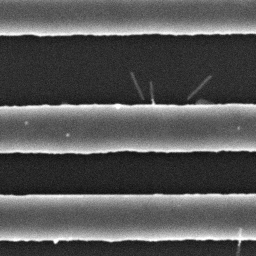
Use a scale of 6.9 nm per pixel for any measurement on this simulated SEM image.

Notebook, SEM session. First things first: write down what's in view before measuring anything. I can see lines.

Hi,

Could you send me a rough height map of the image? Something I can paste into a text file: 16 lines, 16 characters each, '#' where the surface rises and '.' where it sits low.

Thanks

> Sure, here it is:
################
################
................
................
................
................
................
################
################
#######.........
................
................
################
################
################
................